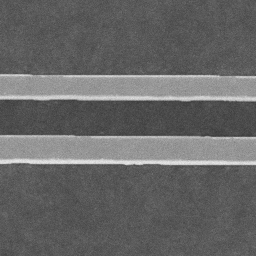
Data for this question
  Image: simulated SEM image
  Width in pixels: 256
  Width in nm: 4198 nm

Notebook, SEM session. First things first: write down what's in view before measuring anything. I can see lines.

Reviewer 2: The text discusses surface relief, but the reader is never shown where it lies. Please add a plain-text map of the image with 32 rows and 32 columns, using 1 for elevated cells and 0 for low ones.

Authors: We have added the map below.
00000000000000000000000000000000
00000000000000000000000000000000
00000000000000000000000000000000
00000000000000000000000000000000
00000000000000000000000000000000
00000000000000000000000000000000
00000000000000000000000000000000
00000000000000000000000000000000
00000000000000000000000000000000
11111111111111111111100000000000
11111111111111111111111111111111
11111111111111111111111111111111
00000000000000000000000000000000
00000000000000000000000000000000
00000000000000000000000000000000
00000000000000000000000000000000
00000000000000000000000000000000
11111111111111111111111111111111
11111111111111111111111111111111
11111111111111111111111111111111
00000000000000000000000010011111
00000000000000000000000000000000
00000000000000000000000000000000
00000000000000000000000000000000
00000000000000000000000000000000
00000000000000000000000000000000
00000000000000000000000000000000
00000000000000000000000000000000
00000000000000000000000000000000
00000000000000000000000000000000
00000000000000000000000000000000
00000000000000000000000000000000